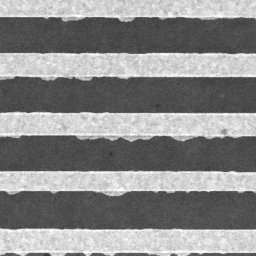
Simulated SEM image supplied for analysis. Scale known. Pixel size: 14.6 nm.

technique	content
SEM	lines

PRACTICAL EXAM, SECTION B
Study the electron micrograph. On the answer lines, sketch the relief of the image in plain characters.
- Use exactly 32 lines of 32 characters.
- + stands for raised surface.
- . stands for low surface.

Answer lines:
++++++++++++++++++++++++++++++++
++++++++++++++++++++++++++++++++
................................
................................
................................
................................
................................
++++++++++++++++++++++++++++++++
++++++++++++++++++++++++++++++++
..+++++++++.+.++++++++++++++++++
................................
................................
................................
................................
++++++++++++++++++++++++++++++++
++++++++++++++++++++++++++++++++
++++++++++++++++++++++++++++++++
................................
................................
................................
................................
++++++++++++++++++++++++++++++..
++++++++++++++++++++++++++++++++
++++++++++++++++++++++++++++++++
................................
................................
................................
................................
................................
++++++++++++++++++++++++++++++++
++++++++++++++++++++++++++++++++
++++++++++++++++++++++++++++++++